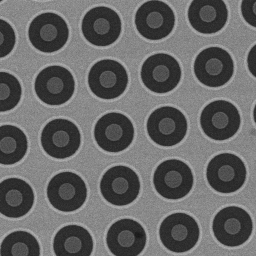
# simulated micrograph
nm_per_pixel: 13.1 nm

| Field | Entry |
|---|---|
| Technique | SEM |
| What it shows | an array of small figures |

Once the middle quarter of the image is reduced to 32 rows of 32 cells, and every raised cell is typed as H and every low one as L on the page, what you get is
HHHHHHHLLLLLLLLHHHHLLLLLHLLLLHHH
LHHHHHLLLLLLLLLLHHHLLLHHHHLLLHHH
LLHHHHLLLHHHLLLLHHHLLLHHHHLLLLHH
LLLHHHLLLHHHHLLLHHHLLLLHHHLLLHHH
LLLHHHLLLHHHHLLLHHHLLLLLLLLLLHHH
LLLHHHLLLLHHLLLLHHHHLLLLLLLLHHHH
LLLHHHLLLLLLLLLLHHHHHLLLLLLLHHHH
LLLHHHHLLLLLLLLHHHHHHHHLLLHHHHHH
LLHHHHHHLLLLLHHHHHHHHHHHHHHHHHHH
LHHHHHHHHHHHHHHHHHHHHHHHHHHHHHHH
HHHHHHHHHHHHHHHHHHHHHHHHLLLHHHHH
HHHHHHHHHHHHHHHHHHHHHHLLLLLLLHHH
HHHHHHHHHHLLLLLHHHHHHLLLLLLLLLHH
LHHHHHHHHLLLLLLLHHHHHLLLLLLLLLLH
LLHHHHHHLLLLLLLLLHHHHLLLHHHLLLLH
LLLHHHHLLLLHHHLLLLHHLLLLHHHHLLLH
LLLLHHHLLLLHHHLLLLHHLLLLHHHHLLLH
HLLLHHHLLLHHHHLLLLHHHLLLLHLLLLLH
HLLLLHHLLLLHHHLLLLHHHLLLLLLLLLHH
HLLLHHHHLLLLLLLLLHHHHHLLLLLLLLHH
LLLLHHHHHLLLLLLLLHHHHHHHLLLLHHHH
LLLLHHHHHLLLLLLHHHHHHHHHHHHHHHHH
LLLHHHHHHHHHHHHHHHHHHHHHHHHHHHHH
LHHHHHHHHHHHHHHHHHHHHHHHHHHHHHHH
HHHHHHHHHHHHHHHHHHHHHHHHLLLLLLHH
HHHHHHHHHHHHLLLLHHHHHHHLLLLLLLLH
HHHHHHHHHHHLLLLLLLHHHHHLLLLLLLLL
LLLHHHHHHHLLLLLLLLHHHHLLLLHHHLLL
LLLLLHHHHLLLLLLLLLLHHHLLLHHHHLLL
LLLLLHHHHLLLHHHHLLLHHHLLLHHHHLLL
HHLLLLHHHLLLHHHHLLLHHHLLLLHHHLLL
HHHLLLHHHLLLLHHHLLLHHHHLLLLLLLLL